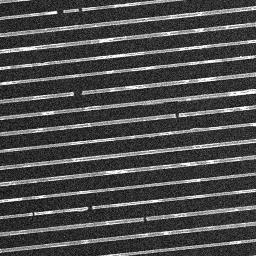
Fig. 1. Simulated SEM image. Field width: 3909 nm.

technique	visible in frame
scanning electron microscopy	parallel lines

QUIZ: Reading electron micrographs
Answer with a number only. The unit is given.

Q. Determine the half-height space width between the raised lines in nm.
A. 207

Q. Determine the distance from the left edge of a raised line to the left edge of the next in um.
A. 0.252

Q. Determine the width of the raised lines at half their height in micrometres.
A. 0.055